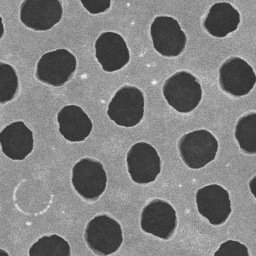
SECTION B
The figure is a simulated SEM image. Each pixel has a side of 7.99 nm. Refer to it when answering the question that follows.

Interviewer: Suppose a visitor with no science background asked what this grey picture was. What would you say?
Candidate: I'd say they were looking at a regular array of holes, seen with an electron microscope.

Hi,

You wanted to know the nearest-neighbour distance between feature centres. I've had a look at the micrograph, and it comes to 454 nm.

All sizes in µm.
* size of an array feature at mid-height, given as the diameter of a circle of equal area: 0.297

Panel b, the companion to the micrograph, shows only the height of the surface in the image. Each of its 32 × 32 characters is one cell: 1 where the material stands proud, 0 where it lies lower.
11100000110000111111111111100111
11100000111001111111111111000011
11100001111111111110001111000011
11110011111111111110000111000011
11111111111110011110000111101111
11111111111100001110000111111111
11111100011100001111000111111111
11111000011100001111111111111011
01111000011110011111111111110001
00111000011111111111100011110000
00111100111111111111100001110000
00111111111111100011000001111001
01111111111111000011100001111111
11111111001111000011110011111111
11111110000111000011111111111110
10011110000011100111111111111100
00001111000111111111111100111000
00001111101111111111111000011100
00001111111111110001110000011100
10011111111111110000111000011111
11111111100001110000111000111111
11111111100001110000111111111111
11111111100001111001111111111110
11111111100001111111111110001110
11111111110011111111111110000111
11111111111111111110011110000111
11111111111111111100001110000111
11111111111000111100001111001111
11111111111000011100001111111111
11111101111000011111011111111111
11110000011000011111111111110011
01110000011100111111111111100001